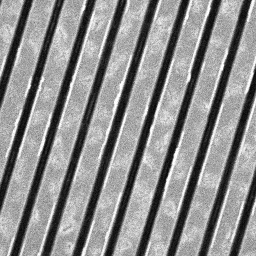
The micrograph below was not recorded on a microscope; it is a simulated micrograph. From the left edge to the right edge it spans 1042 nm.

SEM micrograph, parallel lines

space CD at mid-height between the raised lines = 32.2 nm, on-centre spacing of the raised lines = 122 nanometres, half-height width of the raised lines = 88.2 nm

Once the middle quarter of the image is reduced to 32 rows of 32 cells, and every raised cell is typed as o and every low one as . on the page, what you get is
o..oooooo..oooooo..ooooo..oooooo
o..ooooo...ooooo..oooooo..oooooo
..oooooo..oooooo..oooooo..oooooo
..oooooo..oooooo..ooooo..ooooooo
..ooooo...ooooo..oooooo..oooooo.
.oooooo..oooooo..oooooo..oooooo.
.oooooo..oooooo..ooooo...ooooo..
.ooooo...ooooo...ooooo..oooooo..
.ooooo..oooooo..oooooo..oooooo..
oooooo..oooooo..oooooo..oooooo..
oooooo..oooooo..ooooo..oooooo..o
ooooo...ooooo..oooooo..oooooo..o
ooooo..oooooo..oooooo..oooooo..o
ooooo..oooooo..ooooo..oooooo..oo
oooo...ooooo..oooooo..oooooo..oo
oooo..oooooo..oooooo..oooooo..oo
oooo..oooooo..ooooo...ooooo...oo
ooo...ooooo...ooooo..oooooo..ooo
ooo...ooooo..oooooo..oooooo..ooo
ooo..oooooo..oooooo..oooooo..ooo
ooo..ooooo...ooooo..oooooo..oooo
oo...ooooo..oooooo..oooooo..oooo
oo..oooooo..oooooo..oooooo..oooo
oo..ooooo...ooooo..oooooo..ooooo
o..oooooo..oooooo..oooooo..ooooo
o..oooooo..oooooo..oooooo..ooooo
o..oooooo..ooooo...ooooo..oooooo
...ooooo..oooooo..oooooo..oooooo
..oooooo..oooooo..oooooo..oooooo
..oooooo..oooooo..ooooo...ooooo.
..oooooo..ooooo..oooooo..oooooo.
.oooooo..oooooo..oooooo..oooooo.